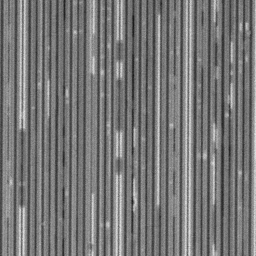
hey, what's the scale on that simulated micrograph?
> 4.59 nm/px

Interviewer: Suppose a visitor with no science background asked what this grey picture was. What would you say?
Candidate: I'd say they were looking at parallel lines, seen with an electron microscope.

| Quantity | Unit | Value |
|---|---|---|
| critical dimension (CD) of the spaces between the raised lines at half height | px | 2.88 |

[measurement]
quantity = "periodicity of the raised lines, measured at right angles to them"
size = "31.6 nm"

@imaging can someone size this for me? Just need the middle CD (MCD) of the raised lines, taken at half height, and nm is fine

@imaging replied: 21.8